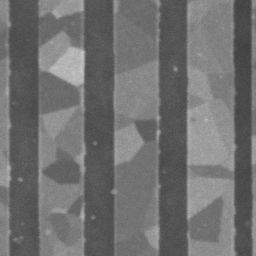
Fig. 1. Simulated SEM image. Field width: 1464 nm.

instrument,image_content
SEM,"lines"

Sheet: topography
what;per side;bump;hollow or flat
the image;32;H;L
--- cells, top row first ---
HLLLLHHHHHLLLLHHHHHHLLLHHHHHHLLL
HLLLLHHHHHLLLLHHHHHHLLLHHHHHHLLL
HLLLLHHHHHLLLLHHHHHHLLLHHHHHHLLH
HLLLLHHHHHLLLLHHHHHHLLLHHHHHHLLL
HLLLLHHHHHLLLLHHHHHHLLLHHHHHHLLL
HLLLLHHHHHLLLLHHHHHHLLLHHHHHHLLL
HLLLLHHHHHLLLLHHHHHHLLLHHHHHHLLL
HLLLLHHHHHLLLLHHHHHHLLLHHHHHHLLL
HLLLLHHHHHLLLLHHHHHHLLLHHHHHHLLL
HLLLLHHHHHLLLLHHHHHHLLLHHHHHHLLL
HLLLLHHHHHLLLLHHHHHHLLLLHHHHHLLL
HLLLLHHHHHLLLLHHHHHHLLLLHHHHHLLL
HLLLLHHHHHLLLLHHHHHHLLLHHHHHHLLL
HLLLLHHHHHLLLLHHHHHHLLLHHHHHHLLL
HLLLLHHHHHLLLLHHHHHHLLLHHHHHHLLL
HLLLLHHHHHLLLLHHHHHHLLLHHHHHHLLL
HLLLLHHHHHLLLLHHHHHHLLLHHHHHHLLL
HLLLLHHHHHLLLLHHHHHHLLLHHHHHHLLL
HLLLLHHHHHLLLLHHHHHHLLLHHHHHHLLL
HLLLLHHHHHLLLLHHHHHHLLLHHHHHHLLL
HLLLLHHHHHLLLLHHHHHHLLLHHHHHHLLL
HLLLLHHHHHLLLLHHHHHHLLLHHHHHHLLL
HLLLLHHHHHLLLLHHHHHHLLLHHHHHHLLL
HLLLLHHHHHLLLLHHHHHHLLLHHHHHHLLL
HLLLLHHHHHLLLLHHHHHHLLLLHHHHHLLL
HLLLLHHHHHLLLLHHHHHHLLLHHHHHHLLL
HLLLLHHHHHLLLLHHHHHHLLLHHHHHHLLL
HLLLLHHHHHLLLLHHHHHHLLLHHHHHHLLL
HLLLLHHHHHLLLLHHHHHHLLLLHHHHHLLL
HLLLLHHHHHLLLLHHHHHHLLLLHHHHHLLL
HLLLLHHHHHLLLLHHHHHHLLLLHHHHHLLL
HLLLLHHHHHLLLLHHHHHHLLLLHHHHHLLL